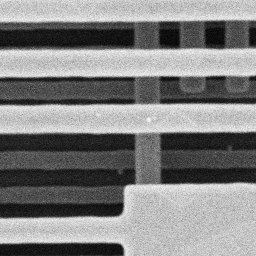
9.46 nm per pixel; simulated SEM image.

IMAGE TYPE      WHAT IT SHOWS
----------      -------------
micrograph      wiring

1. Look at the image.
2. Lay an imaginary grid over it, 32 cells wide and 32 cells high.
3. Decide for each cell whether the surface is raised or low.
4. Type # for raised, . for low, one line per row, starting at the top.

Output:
################################
################################
###########################.###.
.................###..####..###.
.................###...###..###.
.................###...###..###.
################################
################################
################################
#########.##########..####..####
.................###...###..###.
.................###............
.................###............
################################
################################
################################
#####################...........
.................###............
.................###............
.................###............
.................###............
.................###............
.................###............
................################
................################
................################
...............#################
################################
################################
################################
...............#################
................################